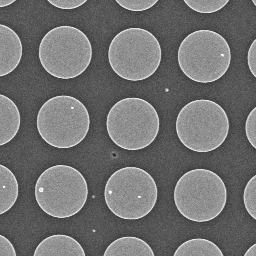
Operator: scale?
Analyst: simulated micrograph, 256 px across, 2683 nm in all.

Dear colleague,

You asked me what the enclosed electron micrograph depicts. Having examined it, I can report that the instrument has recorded an array of small figures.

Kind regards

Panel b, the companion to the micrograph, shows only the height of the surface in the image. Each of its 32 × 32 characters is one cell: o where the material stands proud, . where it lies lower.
o......ooo.....oooo....ooooo....
.........................oo.....
................................
o......oo.......................
oo....ooooo....oooo....ooooo....
ooo..oooooo...oooooo...ooooo....
ooo..oooooo...oooooo..ooooooo..o
oo...oooooo...oooooo..ooooooo..o
oo....ooooo...oooooo...ooooo...o
.......ooo.....oooo....ooooo....
................................
................................
o.....oooo.....ooo.......o......
oo...oooooo...ooooo....ooooo....
oo...oooooo..ooooooo..oooooo...o
oo...oooooo..ooooooo..ooooooo..o
oo...oooooo...oooooo..oooooo...o
o.....oooo....ooooo....ooooo...o
...............ooo......ooo.....
................................
................................
o....ooooo....oooo......oo......
oo...oooooo...ooooo...oooooo...o
oo..ooooooo..ooooooo..oooooo...o
oo..ooooooo..ooooooo..oooooo..oo
oo...oooooo..oooooo...oooooo...o
o.....oooo....ooooo....ooooo...o
........................oo......
................................
.......o........................
o....ooooo....oooo.....oooo.....
oo..oooooo...oooooo...oooooo...o